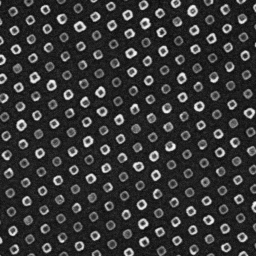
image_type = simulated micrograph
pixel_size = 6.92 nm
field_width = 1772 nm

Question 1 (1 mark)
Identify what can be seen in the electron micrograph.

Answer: a regular array of raised bodies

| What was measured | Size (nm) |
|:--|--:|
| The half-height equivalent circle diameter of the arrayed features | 61.5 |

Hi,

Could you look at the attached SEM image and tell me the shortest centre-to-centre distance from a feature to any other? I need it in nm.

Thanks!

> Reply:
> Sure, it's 128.